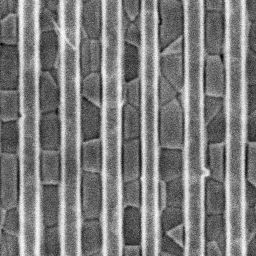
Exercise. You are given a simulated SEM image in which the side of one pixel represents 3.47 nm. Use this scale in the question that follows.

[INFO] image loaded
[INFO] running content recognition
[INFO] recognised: parallel lines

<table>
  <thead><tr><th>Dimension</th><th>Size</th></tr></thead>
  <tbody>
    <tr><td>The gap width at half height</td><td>0.0846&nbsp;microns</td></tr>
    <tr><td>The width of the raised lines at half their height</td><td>0.0595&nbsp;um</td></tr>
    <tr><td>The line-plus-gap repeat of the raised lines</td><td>143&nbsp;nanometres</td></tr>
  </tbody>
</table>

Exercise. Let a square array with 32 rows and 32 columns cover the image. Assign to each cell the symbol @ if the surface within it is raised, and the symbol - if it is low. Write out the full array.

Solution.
---@@---@@---@@---@----@@---@@--
---@@---@@---@@---@@---@@---@@--
---@@---@@---@@---@@---@@---@@--
---@@---@@---@@---@@---@@---@@--
---@@---@@---@@---@@---@@---@@--
---@@---@@---@@---@@---@@---@@--
---@@---@@---@@---@@---@@---@@--
---@@---@@---@@---@@---@@---@@--
---@@---@@---@@---@@---@@---@@--
---@@---@@---@@---@@---@@---@@--
---@@---@@---@@---@----@@---@@--
---@@---@@---@@---@----@@---@@--
---@@---@@---@@---@----@@---@@--
---@@---@@---@@---@----@@---@@--
---@@---@@---@@---@----@@---@@--
---@@---@@---@@---@----@@---@@--
---@@---@@---@@---@@---@@---@@--
---@@---@@---@@---@@---@@---@@--
---@@---@@---@@---@@---@@---@@--
---@@---@@---@@---@@---@@---@@--
---@@---@@---@@---@@---@@---@@--
---@@---@@---@@---@@---@@@--@@--
---@@---@@---@@---@@---@@@--@@--
---@@---@@---@@---@@---@@---@@--
---@@---@@---@@---@@---@@---@@--
---@@---@@---@@---@@---@@---@@@-
---@@---@@---@@---@@---@@---@@@-
---@@---@@---@@---@@---@@---@@@-
---@@---@@---@@---@@---@@---@@@-
---@@---@@---@@---@@---@@---@@@-
---@@---@@---@@---@@---@@---@@@-
---@@---@@---@@---@@---@@---@@@-